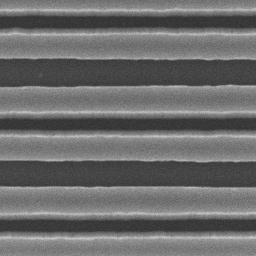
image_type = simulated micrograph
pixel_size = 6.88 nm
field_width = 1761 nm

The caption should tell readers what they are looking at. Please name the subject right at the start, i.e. lines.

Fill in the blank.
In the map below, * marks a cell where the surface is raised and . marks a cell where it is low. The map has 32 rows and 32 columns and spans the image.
********************************
***..*****************.*.**.....
................................
................................
********************************
********************************
********************************
................................
................................
................................
................................
********************************
********************************
********************************
................................
................................
................................
********************************
********************************
********************************
................................
................................
................................
****.******.*.***********.......
********************************
********************************
********************************
................................
................................
.*.................**.....******
********************************
********************************